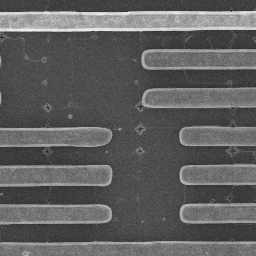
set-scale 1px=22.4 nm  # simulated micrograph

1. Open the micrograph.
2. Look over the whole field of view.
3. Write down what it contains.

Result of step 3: wiring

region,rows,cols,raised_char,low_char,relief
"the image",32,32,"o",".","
................................
................................
oooooooooooooooooooooooooooooooo
oooooooooooooooooooooooooo....oo
................................
................................
..................oooooooooooooo
..................oooooooooooooo
...................oo...........
................................
................................
..................oooooooooooooo
..................oooooooooooooo
................................
................................
................................
ooooooooooooo..........ooooooooo
ooooooooooooo..........ooooooooo
................................
................................
................................
oooooooooooooo.........ooooooooo
oooooooooooooo.........ooooooooo
................................
................................
................................
oooooooooooooo.........ooooooooo
ooooooooooooo..........ooooooooo
................................
................................
.........ooooooo.ooooooooooooooo
oooooooooooooooooooooooooooooooo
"